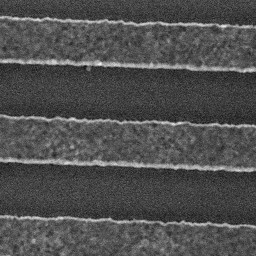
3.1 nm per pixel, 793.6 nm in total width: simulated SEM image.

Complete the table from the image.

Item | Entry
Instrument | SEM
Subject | lines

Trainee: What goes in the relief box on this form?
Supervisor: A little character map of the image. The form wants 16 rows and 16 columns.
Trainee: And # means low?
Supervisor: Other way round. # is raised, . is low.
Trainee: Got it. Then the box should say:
................
###########.....
################
################
...............#
................
................
#####...........
################
################
...........#####
................
................
#...............
################
################